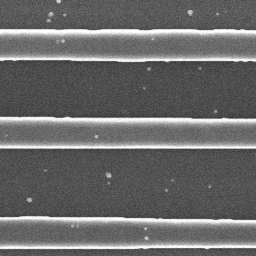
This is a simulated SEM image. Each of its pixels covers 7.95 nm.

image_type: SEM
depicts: lines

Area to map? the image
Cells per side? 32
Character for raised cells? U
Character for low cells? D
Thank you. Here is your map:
DDDDDDDDDDDDDDDDDDDDDDDDDDDDDDDD
DDDDDDDDDDDDDDDDDDDDDDDDDDDDDDDD
DDDDDDDDDDDDDDDDDDDDDDDDDDDDDDDD
DDDDDDDDDDDDDDDDDDDDDDDDDDDDDDDD
UUUUUUUUUUUUUUUUUUUUUUUUUUUUUUUU
UUUUUUUUUUUUUUUUUUUUUUUUUUUUUUUU
UUUUUUUUUUUUUUUUUUUUUUUUUUUUUUUU
DDDDDDDDDUUUUUUUUUUUUUUUUUUUUUUU
DDDDDDDDDDDDDDDDDDDDDDDDDDDDDDDD
DDDDDDDDDDDDDDDDDDDDDDDDDDDDDDDD
DDDDDDDDDDDDDDDDDDDDDDDDDDDDDDDD
DDDDDDDDDDDDDDDDDDDDDDDDDDDDDDDD
DDDDDDDDDDDDDDDDDDDDDDDDDDDDDDDD
DDDDDDDDDDDDDDDDDDDDDDDDDDDDDDDD
DDDDDDDDDDDDDDDDDDDDDDDDDDDDDDDD
UUUUUUUUUUUUUUUUUUUUUUUUUUUUUUUU
UUUUUUUUUUUUUUUUUUUUUUUUUUUUUUUU
UUUUUUUUUUUUUUUUUUUUUUUUUUUUUUUU
DDDDDDDDDDDDDDDDDDDDDDDDDDDDDDDD
DDDDDDDDDDDDDDDDDDDDDDDDDDDDDDDD
DDDDDDDDDDDDDDDDDDDDDDDDDDDDDDDD
DDDDDDDDDDDDDDDDDDDDDDDDDDDDDDDD
DDDDDDDDDDDDDDDDDDDDDDDDDDDDDDDD
DDDDDDDDDDDDDDDDDDDDDDDDDDDDDDDD
DDDDDDDDDDDDDDDDDDDDDDDDDDDDDDDD
DDDDDDDDDDDDDDDDDDDDDDDDDDDDDDDD
DDDDDDDDDDDDDDDDDDDDDDDDDDDDDDDD
UUUUUUUUUUUUUUUUUUUUUUUUUUUUUDDD
UUUUUUUUUUUUUUUUUUUUUUUUUUUUUUUU
UUUUUUUUUUUUUUUUUUUUUUUUUUUUUUUU
UUUUUUUUUUUUUUUUUUUUUUUUUUUUUUUU
DDDDDDDDDDDDDDDDDDDDDDDDDDDDDDDD